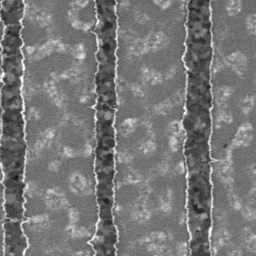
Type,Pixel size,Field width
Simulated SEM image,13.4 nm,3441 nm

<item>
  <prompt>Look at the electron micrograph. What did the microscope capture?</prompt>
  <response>one or a few lines or trenches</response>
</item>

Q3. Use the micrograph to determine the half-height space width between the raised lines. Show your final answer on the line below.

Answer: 70.2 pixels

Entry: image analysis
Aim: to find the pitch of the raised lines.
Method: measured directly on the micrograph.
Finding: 1250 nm